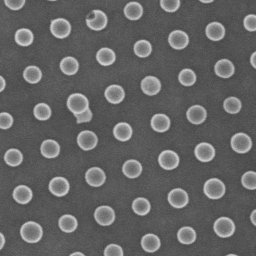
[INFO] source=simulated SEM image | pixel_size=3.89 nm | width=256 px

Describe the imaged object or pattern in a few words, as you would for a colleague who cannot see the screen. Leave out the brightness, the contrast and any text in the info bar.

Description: a regular array of raised bodies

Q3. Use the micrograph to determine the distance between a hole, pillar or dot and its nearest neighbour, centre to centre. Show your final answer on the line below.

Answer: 145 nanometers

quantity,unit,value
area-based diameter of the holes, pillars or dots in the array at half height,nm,69.6